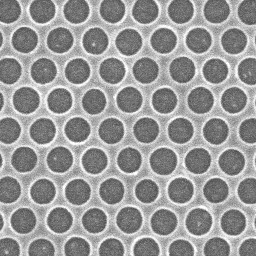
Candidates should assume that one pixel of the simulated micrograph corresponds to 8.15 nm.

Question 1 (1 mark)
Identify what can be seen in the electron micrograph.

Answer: a regular array of holes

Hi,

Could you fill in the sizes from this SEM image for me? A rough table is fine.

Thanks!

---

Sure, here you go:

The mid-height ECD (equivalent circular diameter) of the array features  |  220 nm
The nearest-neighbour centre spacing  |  0.275 micrometres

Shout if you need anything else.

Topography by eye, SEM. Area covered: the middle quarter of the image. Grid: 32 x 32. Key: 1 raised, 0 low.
00000011100000011000000011000000
00000001000000001000000011000000
00000001100000011000000011000000
00000011100000011100000111100000
10000111110000111110001111110001
11111111111111110111111111111111
01111100011111000001111000011111
00111000001110000001110000001110
00111000000110000000110000001110
00110000000110000000110000001110
00110000000110000001110000001110
01111000001111000001111000001111
11111100011111111111111110111111
11000111111001111110001111110011
10000011100000011100000111100000
00000001100000011000000011000000
00000001000000011000000011000000
00000001000000011000000011000000
10000011100000011100000111000000
11001111110000111110001111100001
11111111111111111111111111111111
01111100001111000011111000011111
00111000000110000001110000001100
00110000000110000000100000001100
00110000000110000000100000001100
00110000000110000001110000001100
01111000001111000001110000001110
11111100011111111111111000011111
11101111111001111111111111110011
10000011110000011110000111000000
00000001100000011100000011000000
00000001100000011000000011000000